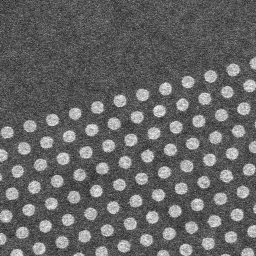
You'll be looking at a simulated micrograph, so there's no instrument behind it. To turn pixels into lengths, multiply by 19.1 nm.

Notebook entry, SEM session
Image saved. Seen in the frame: a regular array of raised bodies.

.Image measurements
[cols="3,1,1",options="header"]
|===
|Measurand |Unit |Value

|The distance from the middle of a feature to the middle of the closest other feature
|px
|23.1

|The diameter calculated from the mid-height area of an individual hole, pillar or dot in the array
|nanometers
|219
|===